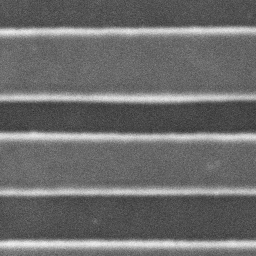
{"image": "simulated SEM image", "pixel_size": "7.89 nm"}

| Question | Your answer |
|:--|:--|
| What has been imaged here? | lines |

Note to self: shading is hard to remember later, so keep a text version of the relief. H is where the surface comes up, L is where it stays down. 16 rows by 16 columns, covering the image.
LLLLLLLLLLLLLLLL
LLLLLLLLLLLLLLLL
HHHHHHHHHHHHHHHH
HHHHHHHHHHHHHHHH
HHHHHHHHHHHHHHHH
HHHHHHHHHHHHHHHH
LLLLLLLLLLLLLLLL
LLLLLLLLLLLLLLLL
HHHHHHHHLLHLHLLL
HHHHHHHHHHHHHHHH
HHHHHHHHHHHHHHHH
HHHHHHHHHHHHHHHH
LLLLLLLLLLLLLLLL
LLLLLLLLLLLLLLLL
LLLLLLLLLLLLLLLL
HHHHHHHHHHHHHHHH